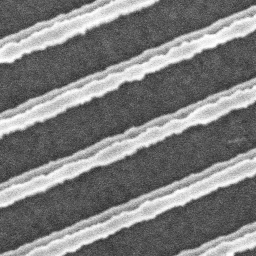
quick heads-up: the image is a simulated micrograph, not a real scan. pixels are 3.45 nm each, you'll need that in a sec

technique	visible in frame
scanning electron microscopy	lines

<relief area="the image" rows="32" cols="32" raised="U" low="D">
DDDDDDDDDDDUUUUUUUDDDDDDDDDDDDDD
DDDDDDDDDUUUUUUDDDDDDDDDDDDDDDUU
DDDDDDDUUUUUUDDDDDDDDDDDDDDDUUUU
DDDDUUUUUUUDDDDDDDDDDDDDDDUUUUUU
DUUUUUUUUDDDDDDDDDDDDDDUUUUUUDDD
UUUUUUDDDDDDDDDDDDDDDUUUUUUDDDDD
UUUDDDDDDDDDDDDDDDUUUUUUUDDDDDDD
UDDDDDDDDDDDDDDDUUUUUUDDDDDDDDDD
DDDDDDDDDDDDDDUUUUUUDDDDDDDDDDDD
DDDDDDDDDDDUUUUUUUDDDDDDDDDDDDDD
DDDDDDDDDUUUUUUDDDDDDDDDDDDDDDUU
DDDDDDUUUUUUUDDDDDDDDDDDDDDDUUUU
DDDDUUUUUUUDDDDDDDDDDDDDDDUUUUUU
DDUUUUUUDDDDDDDDDDDDDDDUUUUUUDDD
UUUUUUDDDDDDDDDDDDDDDUUUUUUDDDDD
UUUUDDDDDDDDDDDDDDUUUUUUDDDDDDDD
UDDDDDDDDDDDDDDDUUUUUUDDDDDDDDDD
DDDDDDDDDDDDDUUUUUUUDDDDDDDDDDDD
DDDDDDDDDDDUUUUUUDDDDDDDDDDDDDDD
DDDDDDDDDUUUUUUDDDDDDDDDDDDDDDUU
DDDDDDUUUUUUDDDDDDDDDDDDDDDUUUUU
DDDUUUUUUUDDDDDDDDDDDDDDDUUUUUUU
DUUUUUUUDDDDDDDDDDDDDDDUUUUUUUDD
UUUUUUDDDDDDDDDDDDDDUUUUUUUDDDDD
UUUDDDDDDDDDDDDDDDUUUUUUUDDDDDDD
UDDDDDDDDDDDDDDDUUUUUUUDDDDDDDDD
DDDDDDDDDDDDDUUUUUUUDDDDDDDDDDDD
DDDDDDDDDDDUUUUUUUDDDDDDDDDDDDDD
DDDDDDDDDUUUUUUDDDDDDDDDDDDDDDUU
DDDDDDUUUUUUUDDDDDDDDDDDDDDDUUUU
DDDDUUUUUUUDDDDDDDDDDDDDDDUUUUUU
DUUUUUUUDDDDDDDDDDDDDDDUUUUUUDDD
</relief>